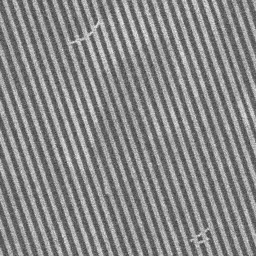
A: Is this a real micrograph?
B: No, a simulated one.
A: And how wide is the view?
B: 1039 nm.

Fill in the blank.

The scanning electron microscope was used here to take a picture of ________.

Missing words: parallel lines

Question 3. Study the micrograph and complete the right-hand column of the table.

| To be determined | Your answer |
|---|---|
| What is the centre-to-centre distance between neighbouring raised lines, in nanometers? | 38.4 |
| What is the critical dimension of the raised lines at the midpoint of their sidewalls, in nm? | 15.8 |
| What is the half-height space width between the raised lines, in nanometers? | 24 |